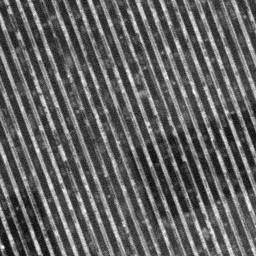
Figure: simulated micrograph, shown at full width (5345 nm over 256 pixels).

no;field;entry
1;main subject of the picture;parallel lines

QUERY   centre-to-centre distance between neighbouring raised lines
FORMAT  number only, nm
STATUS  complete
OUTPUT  234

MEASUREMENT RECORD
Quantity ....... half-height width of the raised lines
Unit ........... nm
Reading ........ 61.1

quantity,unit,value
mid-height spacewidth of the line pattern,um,0.183